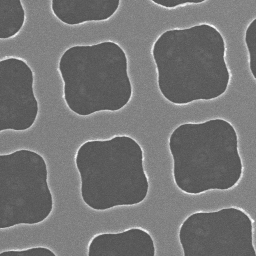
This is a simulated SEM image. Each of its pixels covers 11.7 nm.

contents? holes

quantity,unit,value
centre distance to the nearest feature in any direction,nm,1100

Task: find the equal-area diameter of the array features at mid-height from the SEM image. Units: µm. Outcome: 0.861